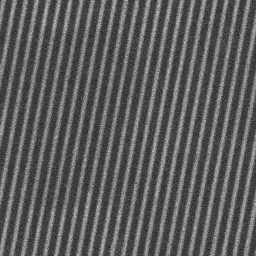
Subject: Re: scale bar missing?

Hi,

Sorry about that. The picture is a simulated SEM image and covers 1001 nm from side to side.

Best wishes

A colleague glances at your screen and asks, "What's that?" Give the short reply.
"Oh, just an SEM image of parallel lines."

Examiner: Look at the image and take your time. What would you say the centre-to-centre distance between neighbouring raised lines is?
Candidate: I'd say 42.8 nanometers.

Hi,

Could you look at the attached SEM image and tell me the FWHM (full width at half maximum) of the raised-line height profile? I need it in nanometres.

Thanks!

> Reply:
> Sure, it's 12.9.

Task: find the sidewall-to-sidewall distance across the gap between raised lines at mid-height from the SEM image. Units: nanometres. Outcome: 28.8